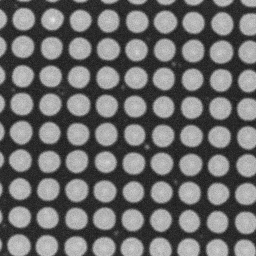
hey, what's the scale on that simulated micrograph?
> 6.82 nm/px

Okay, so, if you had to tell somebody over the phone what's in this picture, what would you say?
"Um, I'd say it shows an array of small figures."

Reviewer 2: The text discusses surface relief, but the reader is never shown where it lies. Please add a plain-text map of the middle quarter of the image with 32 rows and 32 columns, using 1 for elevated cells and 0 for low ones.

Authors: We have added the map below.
00000000000000000000000000000000
00111100011110001111000111000001
01111100111110001111100111100011
01111100111111011111101111100011
01111100111110011111101111100011
00111000011110001111000111100011
00000000000000000000000000000001
00000000000000000000000000000000
01111100011100001110000011000001
01111100111110011111000111100011
01111100111110011111101111100011
01111100111110011111001111100011
00111100011100001111000111100011
00000000000000000000000000000001
00000000000000000000000000000000
00111000011110001110000011000001
01111100111110011111000111100011
01111100111110011111001111100111
01111100111110011111001111100111
00111000011110001111000111100011
00000000000000000000000011000001
00000000000000000000000000000000
01111100011100001100000111000000
01111100111110011111001111100111
01111100111110011111001111100111
01111100111110011111001111100111
01111000011100011111001111100111
00000000000000000000000010000011
00000000000000000000000000000000
00111000011000000100000010000000
01111100111110011110001111000111
11111100111110011111001111100111